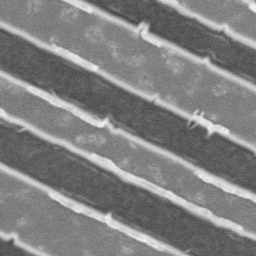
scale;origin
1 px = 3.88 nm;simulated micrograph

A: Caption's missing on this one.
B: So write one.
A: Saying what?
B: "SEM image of one or a few lines or trenches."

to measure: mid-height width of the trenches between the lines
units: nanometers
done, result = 166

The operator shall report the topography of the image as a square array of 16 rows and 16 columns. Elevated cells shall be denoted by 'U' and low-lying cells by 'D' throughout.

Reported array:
UUUUUUDDDDDUUUUU
UUUUUUUUDDDDDUUU
DDUUUUUUUUDDDDDU
DDDDUUUUUUUUDDDD
DDDDDDUUUUUUUUDD
UUDDDDDDUUUUUUUU
UUUUDDDDDDUUUUUU
DUUUUUDDDDDDUUUU
DDDUUUUUDDDDDDUU
DDDDDUUUUUDDDDDD
DDDDDDDUUUUUDDDD
UUDDDDDDDUUUUUDD
UUUUDDDDDDDUUUUU
UUUUUUUDDDDDDUUU
UUUUUUUUDDDDDDDU
DDUUUUUUUUUDDDDD